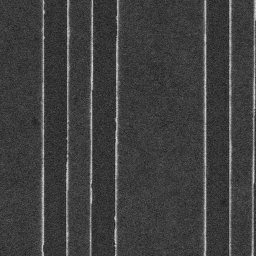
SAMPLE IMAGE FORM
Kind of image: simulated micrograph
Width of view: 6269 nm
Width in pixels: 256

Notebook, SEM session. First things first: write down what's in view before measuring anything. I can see lines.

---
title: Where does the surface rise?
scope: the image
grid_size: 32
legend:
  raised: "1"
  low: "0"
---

11111000111100011111111111000111
11111000111100011111111111000111
11111000111100011111111111000111
11111000111100011111111111000111
11111000111100011111111111000111
11111000111100011111111111000111
11111000111100011111111111000111
11111000111100011111111111000111
11111000111100011111111111000111
11111000111100011111111111000111
11111000111000011111111111000111
11111000111000011111111111000111
11111000111000011111111111000111
11111000111000011111111111000111
11111000111000011111111111000111
11111000111000011111111111000111
11111000111000011111111111000111
11111000111000011111111111000111
11111000111000011111111111000111
11111000111000011111111111000111
11111000111000011111111111000111
11111000111000011111111111000111
11111000111000011111111111000111
11111000111000011111111111000111
11111000111000011111111111000111
11111000111000011111111111000111
11111000111000011111111111000111
11111000111000111111111111000111
11111000111000111111111111000111
11111000111000111111111111000111
11111000111000111111111111000111
11111000111000011111111111000111